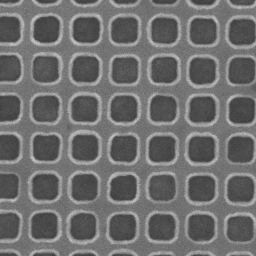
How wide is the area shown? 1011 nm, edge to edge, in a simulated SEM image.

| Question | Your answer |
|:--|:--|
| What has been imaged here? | a regular array of holes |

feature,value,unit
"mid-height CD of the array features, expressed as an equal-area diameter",115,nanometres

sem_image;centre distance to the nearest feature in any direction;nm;153